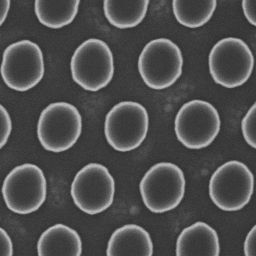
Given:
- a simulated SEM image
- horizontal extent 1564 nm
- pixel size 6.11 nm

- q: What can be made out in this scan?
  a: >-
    a regular array of raised bodies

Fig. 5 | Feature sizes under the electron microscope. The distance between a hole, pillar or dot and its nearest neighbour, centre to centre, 68.6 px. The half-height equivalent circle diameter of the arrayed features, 272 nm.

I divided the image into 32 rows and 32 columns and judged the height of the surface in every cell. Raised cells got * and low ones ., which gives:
*....*****...*****....*****...**
*....****....*****....*****....*
.....****.....***.....****.....*
................................
................................
..**......***......***.....***..
.****.....****....****....*****.
*****....*****...******...******
*****....*****...******...*****.
*****....*****....****.....****.
.***......***......**.......**..
................................
................................
......***.....****.....****.....
*....*****...*****....*****....*
*....*****...*****....*****...**
*....*****...*****....*****....*
*....****.....****.....***.....*
......**.......**...............
................................
............................**..
..***.....***......****....****.
.****....*****....*****...*****.
******...*****....*****...*****.
.*****...*****....*****...*****.
.****.....****....****.....****.
..*........*....................
................................
.......*.......**.......**......
*....*****....****.....****....*
*....*****....*****...*****....*
*....*****...******...*****....*